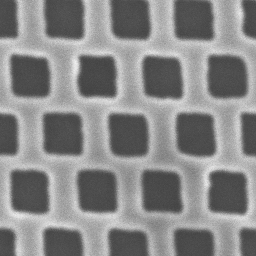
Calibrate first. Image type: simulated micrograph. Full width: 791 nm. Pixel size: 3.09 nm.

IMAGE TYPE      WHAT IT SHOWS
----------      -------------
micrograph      a regular array of holes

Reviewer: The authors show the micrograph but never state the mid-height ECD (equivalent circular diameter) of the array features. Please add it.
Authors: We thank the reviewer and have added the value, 142 nanometers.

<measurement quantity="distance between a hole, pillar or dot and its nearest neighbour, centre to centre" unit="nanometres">201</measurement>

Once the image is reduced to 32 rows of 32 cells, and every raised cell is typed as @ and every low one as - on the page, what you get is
--@@@------@@@-----@@@-----@@@--
--@@@------@@@-----@@@-----@@@--
--@@@@-----@@@-----@@@-----@@@--
--@@@@-----@@@-----@@@-----@@@--
--@@@@-----@@@-----@@@-----@@@@-
@@@@@@@@@@@@@@@@@@@@@@@@@@@@@@@@
@@@@@@@@@@@@@@@@@@@@@@@@@@@@@@@@
@-----@@@@----@@@@----@@@@----@@
@-----@@@@-----@@@-----@@@-----@
@-----@@@@-----@@@-----@@@-----@
@-----@@@@-----@@@-----@@@-----@
@@----@@@@-----@@@-----@@@-----@
@@@@@@@@@@@@@@@@@@@@@@@@@@@@@@@@
@@@@@@@@@@@@@@@@@@@@@@@@@@@@@@@@
--@@@-----@@@@----@@@@-----@@@--
--@@@-----@@@------@@@-----@@@--
--@@@-----@@@@-----@@@-----@@@--
--@@@-----@@@@-----@@@-----@@@--
--@@@-----@@@@-----@@@-----@@@--
@-@@@@@@@@@@@@@---@@@@@@---@@@@-
@@@@@@@@@@@@@@@@@@@@@@@@@@@@@@@@
@-----@@@@----@@@@----@@@@----@@
@-----@@@@-----@@@-----@@@-----@
@-----@@@@-----@@@-----@@@-----@
@-----@@@@-----@@@-----@@@-----@
@-----@@@@-----@@@-----@@@-----@
@@----@@@@@---@@@@@----@@@@----@
@@@@@@@@@@@@@@@@@@@@@@@@@@@@@@@@
-@@@@@--@@@@@@@@@@@@@@-@@@@@@@-@
--@@@-----@@@-----@@@@-----@@@--
--@@@-----@@@@-----@@@-----@@@--
--@@@------@@@-----@@@-----@@@--